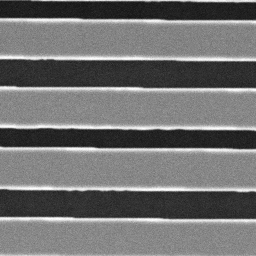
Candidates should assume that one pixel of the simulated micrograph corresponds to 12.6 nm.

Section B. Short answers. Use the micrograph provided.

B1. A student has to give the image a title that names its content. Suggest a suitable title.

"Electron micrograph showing lines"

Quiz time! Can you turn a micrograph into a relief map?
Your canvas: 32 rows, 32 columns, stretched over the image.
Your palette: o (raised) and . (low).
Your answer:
................................
................................
ooooooooooo.....................
oooooooooooooooooooooooooooooooo
oooooooooooooooooooooooooooooooo
oooooooooooooooooooooooooooooooo
oooooooooooooooooooooooooooooooo
.......................ooooooooo
................................
................................
................................
oooooooooooooooooooooooooooooooo
oooooooooooooooooooooooooooooooo
oooooooooooooooooooooooooooooooo
oooooooooooooooooooooooooooooooo
oooooooooooooooooooooooooooooooo
................................
................................
................................
oooooooooooooooooooooooooooooooo
oooooooooooooooooooooooooooooooo
oooooooooooooooooooooooooooooooo
oooooooooooooooooooooooooooooooo
oooooooooooooooooooooooooooooooo
................................
................................
................................
oooooooooooooooooooooooooooooooo
oooooooooooooooooooooooooooooooo
oooooooooooooooooooooooooooooooo
oooooooooooooooooooooooooooooooo
oooooooooooooooooooooooooooooooo